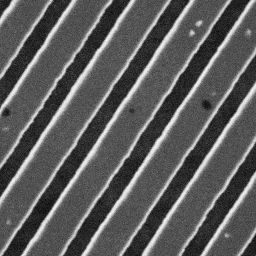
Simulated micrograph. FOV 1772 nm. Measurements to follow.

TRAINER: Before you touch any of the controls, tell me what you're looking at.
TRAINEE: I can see lines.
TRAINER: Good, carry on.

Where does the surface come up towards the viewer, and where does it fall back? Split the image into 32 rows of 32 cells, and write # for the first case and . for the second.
.#####...#####..#####...#####..#
.#####..#####..#####...#####..##
#####..#####...#####..#####...##
####...#####..#####...####...###
####..#####...####...#####..####
###...####...#####..#####...####
##...#####..#####...####...#####
##..#####...####...#####..#####.
#..#####...#####..#####...#####.
...#####..#####...####...#####..
..#####..#####...#####..#####...
..####...#####..#####...#####..#
.#####..#####...####...#####...#
#####...####...#####..#####...##
####...#####..#####...#####..###
####..#####...#####..#####...###
###..#####...#####..#####...####
##...#####..#####...#####..#####
##..#####...#####..#####...####.
#...####...#####...####...#####.
...#####..#####...#####..#####..
..#####...#####..#####...####...
..####...#####...####...#####..#
.#####..#####...#####..#####...#
#####...#####..#####...####...##
####...#####...####...#####..###
####..#####...#####..#####...###
###...####...#####...####...####
##...#####..#####...#####..#####
##..#####...#####..#####...#####
#...#####..#####...####...#####.
...#####...####...#####..#####..